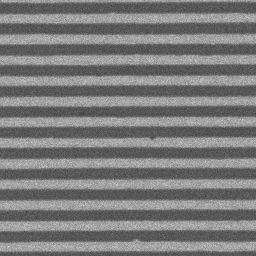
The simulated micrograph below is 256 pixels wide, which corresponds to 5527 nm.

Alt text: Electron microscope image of parallel lines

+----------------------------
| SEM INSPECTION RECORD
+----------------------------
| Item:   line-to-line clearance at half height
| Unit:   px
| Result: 10.4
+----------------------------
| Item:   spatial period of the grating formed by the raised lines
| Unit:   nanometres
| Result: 448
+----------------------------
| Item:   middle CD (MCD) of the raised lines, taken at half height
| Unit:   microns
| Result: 0.221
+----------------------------